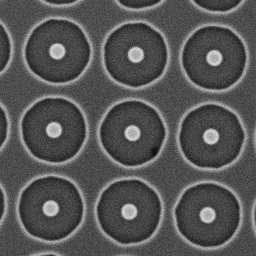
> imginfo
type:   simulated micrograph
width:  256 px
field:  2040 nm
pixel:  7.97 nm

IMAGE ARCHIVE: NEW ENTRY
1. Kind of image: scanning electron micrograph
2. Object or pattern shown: an array of small figures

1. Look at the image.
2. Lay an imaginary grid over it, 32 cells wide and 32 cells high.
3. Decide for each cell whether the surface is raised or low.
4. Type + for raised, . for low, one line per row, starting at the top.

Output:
+++++++.+++++++.....+++++.....++
++++++++++++++++++++++++++++++++
++++++..++++++++++++++++++++++++
.+++......+++++....++++++...++++
.+++.......+++......++++......++
.++........++........++.......++
.++........++........++........+
.++........++........++........+
.+++.......++........++........+
+++++.....++++......+++.......++
+++++++++++++++....+++++.....+++
++++++++++++++++++++++++++++++++
+++++...++++++++++++++++++++++++
++++......++++.....++++++...++++
.++.......+++.......+++.......++
.++........++.......+++.......++
.++........+.........+.........+
.++........++........+.........+
+++.......+++.......+++.......++
++++.....+++++......+++.......++
+++++++++++++++...++++++.....+++
++++++++++++++++++++++++++++++++
++++....++++++++.+++++++++++++++
+++.......+++......+++++....++++
.++.......+++.......+++......+++
.+........++........++........++
.+........++........++........++
+++.......++........++........++
+++.......+++.......++........++
++++....++++++.....++++......+++
++++++++++++++++++++++++....++++
++++++++++++++++++++++++++++++++